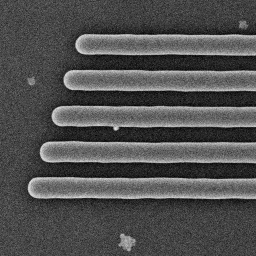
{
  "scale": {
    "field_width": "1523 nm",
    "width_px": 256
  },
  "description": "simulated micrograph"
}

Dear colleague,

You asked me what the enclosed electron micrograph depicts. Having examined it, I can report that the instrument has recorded groups of lines, slits or small figures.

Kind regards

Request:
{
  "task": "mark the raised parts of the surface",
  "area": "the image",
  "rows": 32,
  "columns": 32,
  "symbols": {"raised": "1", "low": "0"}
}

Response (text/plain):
00000000000000000000000000000000
00000000000000000000000000000000
00000000000000000000000000000000
00000000000000000000000000000000
00000000001111111111111111111111
00000000001111111111111111111111
00000000001111111111111111111111
00000000000000000000000000000000
00000000000000000000000000000000
00000000111111111111111111111111
00000000111111111111111111111111
00000000000000000000000000000000
00000000000000000000000000000000
00000001111111111111111111111111
00000001111111111111111111111111
00000001111111111111111111111111
00000000000000000000000000000000
00000000000000000000000000000000
00000111111111111111111111111111
00000111111111111111111111111111
00000000000000000000000000000000
00000000000000000000000000000000
00001111111111111111111111111111
00001111111111111111111111111111
00001111111111111111111111111111
00000000000000000000000000000000
00000000000000000000000000000000
00000000000000000000000000000000
00000000000000000000000000000000
00000000000000010000000000000000
00000000000000011000000000000000
00000000000000000000000000000000